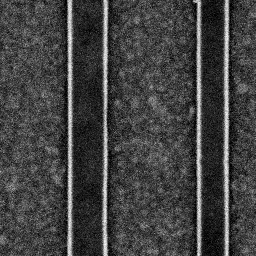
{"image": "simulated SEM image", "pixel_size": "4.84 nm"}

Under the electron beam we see one or a few lines or trenches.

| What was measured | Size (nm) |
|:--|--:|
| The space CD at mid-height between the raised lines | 446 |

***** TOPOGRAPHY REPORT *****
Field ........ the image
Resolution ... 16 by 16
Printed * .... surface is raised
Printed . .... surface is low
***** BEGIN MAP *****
....***.....**..
....***.....**..
....***.....**..
....***.....**..
....***.....**..
....***.....**..
....***.....**..
....***.....**..
....***.....**..
....***.....**..
....***.....**..
....***.....**..
....***.....**..
....***.....**..
....***.....**..
....***.....**..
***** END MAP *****